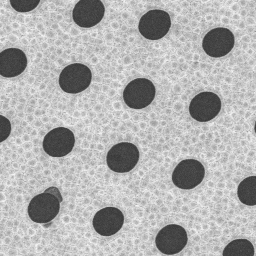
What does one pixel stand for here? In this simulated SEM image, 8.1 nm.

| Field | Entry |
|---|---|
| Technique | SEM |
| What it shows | a regular array of holes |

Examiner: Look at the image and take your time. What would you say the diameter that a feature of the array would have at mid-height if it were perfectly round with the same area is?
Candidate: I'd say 255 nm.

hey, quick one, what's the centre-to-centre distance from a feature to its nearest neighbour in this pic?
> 533 nm